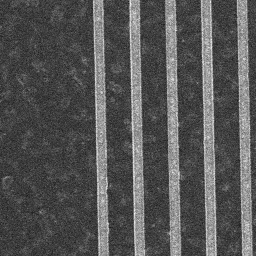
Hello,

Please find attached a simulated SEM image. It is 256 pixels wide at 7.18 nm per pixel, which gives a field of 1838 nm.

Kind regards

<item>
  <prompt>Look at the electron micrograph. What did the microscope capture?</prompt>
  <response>parallel lines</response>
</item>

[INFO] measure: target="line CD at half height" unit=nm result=65.5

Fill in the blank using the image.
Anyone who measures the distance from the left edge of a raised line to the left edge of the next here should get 258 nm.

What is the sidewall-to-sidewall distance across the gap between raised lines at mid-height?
0.188 µm